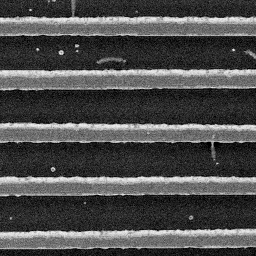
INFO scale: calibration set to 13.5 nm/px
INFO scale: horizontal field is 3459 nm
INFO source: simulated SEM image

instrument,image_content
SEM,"lines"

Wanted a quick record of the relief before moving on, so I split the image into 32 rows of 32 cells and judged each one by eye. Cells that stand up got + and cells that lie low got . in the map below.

................................
................................
++++++++++++++++++++++++++++++++
++++++++++++++++++++++++++++++++
................................
................................
................................
................................
................................
++++++++++++++++++++++++++++++++
++++++++++++++++++++++++++++++++
................................
................................
................................
................................
................................
++++++++++++++++++++++++++++++++
++++++++++++++++++++++++++++++++
................................
................................
................................
................................
+++++++++++++++..+++++++++++++++
++++++++++++++++++++++++++++++++
................................
................................
................................
................................
................................
++++++++++++++++++++++++++++++++
++++++++++++++++++++++++++++++++
................................